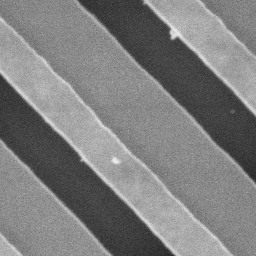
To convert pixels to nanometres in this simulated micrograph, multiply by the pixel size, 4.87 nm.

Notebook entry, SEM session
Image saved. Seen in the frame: lines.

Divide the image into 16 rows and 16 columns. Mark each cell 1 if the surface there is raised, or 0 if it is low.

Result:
1111100001111111
1111110000111111
1111111000011111
1111111100001111
1111111110000111
0111111111000011
0011111111100001
0001111111110000
0000111111111000
1000011111111100
1100001111111110
1110000111111111
1111000011111111
1111100001111111
1111110000111111
1111110000011111